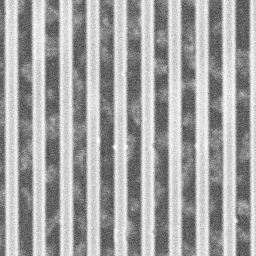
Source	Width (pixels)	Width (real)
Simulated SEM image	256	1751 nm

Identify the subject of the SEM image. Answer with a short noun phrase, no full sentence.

parallel lines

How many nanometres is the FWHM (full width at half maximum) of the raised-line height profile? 71.9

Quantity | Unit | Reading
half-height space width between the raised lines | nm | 110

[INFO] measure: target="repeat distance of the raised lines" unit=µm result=0.186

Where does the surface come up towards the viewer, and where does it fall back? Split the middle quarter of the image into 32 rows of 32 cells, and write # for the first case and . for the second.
##....##.....##.....##....###...
##....##.....##.....##....###...
##....##.....##.....##....###...
##....##.....##.....##....###...
##....##.....##.....##....###...
##....##.....##.....##....###...
##....##.....##.....##....###...
##....##.....##.....##....###...
##....##.....##.....##....###...
##....##.....##.....##....###...
##....##.....##.....##....###...
##....##.....##.....##....###...
##....##.....##.....##....###...
##....##.....##.....##....###...
##....##.....##.....##....###...
##....##.....##.....##....###...
##....##.....##.....##....###...
##....##.....##.....##.....##...
##....###....##.....##.....##...
##....###....##.....##.....##...
##....##.....###....##.....##...
##....##.....##.....##.....##...
##....##.....##.....##.....##...
##....##.....##.....##.....##...
##....##.....##.....##.....##...
##....##.....##.....##.....##...
##....##.....##.....##.....##...
##....###....##.....##.....##...
##....###....##.....##.....##...
##....###....##.....##.....##...
##....###....##.....##.....##...
##....###....##.....##.....##...